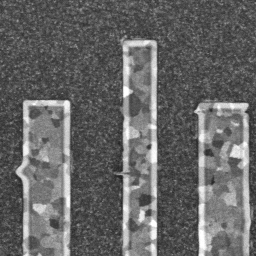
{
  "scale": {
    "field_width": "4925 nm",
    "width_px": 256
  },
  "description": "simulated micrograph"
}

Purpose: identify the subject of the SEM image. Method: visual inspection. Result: one or a few lines or trenches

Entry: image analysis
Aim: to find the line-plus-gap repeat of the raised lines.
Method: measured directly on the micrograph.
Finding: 1710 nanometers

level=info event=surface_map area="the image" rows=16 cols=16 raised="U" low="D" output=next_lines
DDDDDDDDDDDDDDDD
DDDDDDDDDDDDDDDD
DDDDDDDDDDDDDDDD
DDDDDDDDUUDDDDDD
DDDDDDDDUUDDDDDD
DDDDDDDDUUDDDDDD
DDUUDDDDUUDDDDDD
DDUUDDDDUUDDDUUD
DDUUDDDDUUDDDUUD
DDUUDDDDUUDDDUUD
DUUUDDDDUUDDDUUD
DDUUDDDDUUDDDUUD
DDUUDDDDUUDDDUUD
DDUUDDDDUUDDDUUD
DDUUDDDDUUDDDUUD
DDUUDDDDUUDDDUUD